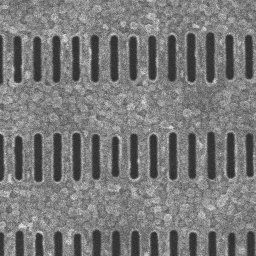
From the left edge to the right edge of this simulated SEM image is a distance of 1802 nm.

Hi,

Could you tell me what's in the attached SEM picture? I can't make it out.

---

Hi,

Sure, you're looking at a regular array of holes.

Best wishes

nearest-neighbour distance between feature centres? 0.134 µm